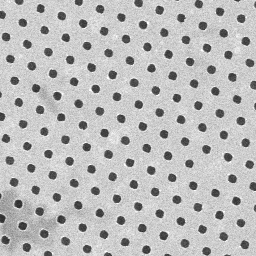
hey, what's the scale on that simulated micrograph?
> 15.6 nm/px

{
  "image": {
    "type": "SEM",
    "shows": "a regular array of holes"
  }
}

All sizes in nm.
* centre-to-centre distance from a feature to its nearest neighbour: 343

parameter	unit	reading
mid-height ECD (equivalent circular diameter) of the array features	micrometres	0.139